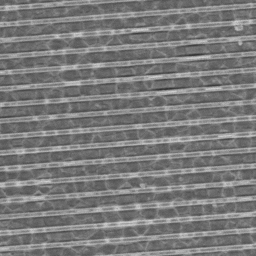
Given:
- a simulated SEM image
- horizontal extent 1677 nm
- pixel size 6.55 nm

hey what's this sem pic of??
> parallel lines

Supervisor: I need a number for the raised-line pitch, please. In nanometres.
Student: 105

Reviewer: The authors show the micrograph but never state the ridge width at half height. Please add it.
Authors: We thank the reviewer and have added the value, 27.8 nanometers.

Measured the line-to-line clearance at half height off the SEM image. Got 77.5 nm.